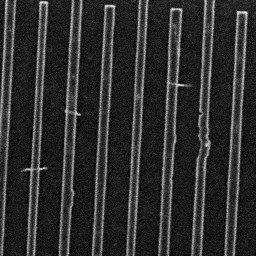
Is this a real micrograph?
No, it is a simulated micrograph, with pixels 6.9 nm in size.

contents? parallel lines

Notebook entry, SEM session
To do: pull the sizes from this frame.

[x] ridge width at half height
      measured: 0.0612 um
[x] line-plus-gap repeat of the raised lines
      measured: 0.228 micrometres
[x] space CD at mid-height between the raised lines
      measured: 164 nanometres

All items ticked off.